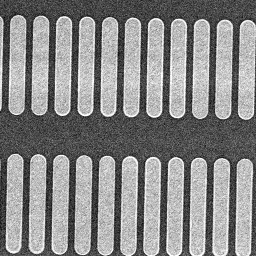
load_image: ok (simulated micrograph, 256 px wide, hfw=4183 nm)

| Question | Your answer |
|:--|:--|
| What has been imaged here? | groups of lines, slits or small figures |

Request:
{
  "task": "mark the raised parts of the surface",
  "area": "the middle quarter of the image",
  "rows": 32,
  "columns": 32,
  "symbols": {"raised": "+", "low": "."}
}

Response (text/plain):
++..+++...+++..++++..++++..+++..
++..+++...+++..++++..++++..+++..
++..+++...+++..++++..++++..+++..
++..+++...+++..++++..+++...+++..
+...+++...+++..++++..+++...+++..
+...+++...+++..++++..+++...+++..
+...+++...+++..++++..+++...+++..
+...+++...+++..++++..+++...+++..
+...+++...+++..++++..+++...+++..
+...+++...+++..++++..+++...+++..
+...+++...+++..++++..+++...+++..
+...+++...+++..++++..+++...+++..
+...++....++....++...+++...+++..
................................
................................
................................
................................
................................
................................
................................
................................
................................
................................
+...++....++....+...............
+..++++..++++..+++...+++..++++..
+..++++..++++..+++...+++..++++..
+..++++..++++..+++...+++..++++..
+..++++..++++..+++...+++..++++..
+..++++..++++..+++..++++..++++..
+..++++..++++..+++..++++..++++..
+..++++..++++..+++..++++..++++..
+..++++..++++..+++..++++..++++..